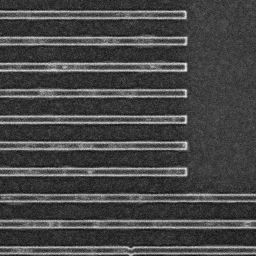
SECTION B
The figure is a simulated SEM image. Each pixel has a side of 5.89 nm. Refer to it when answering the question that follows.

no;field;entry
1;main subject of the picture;parallel lines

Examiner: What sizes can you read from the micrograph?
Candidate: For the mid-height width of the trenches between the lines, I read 113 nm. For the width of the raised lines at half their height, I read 0.0397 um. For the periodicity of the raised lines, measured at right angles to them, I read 154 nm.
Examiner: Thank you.